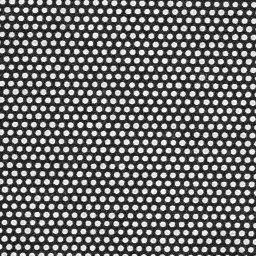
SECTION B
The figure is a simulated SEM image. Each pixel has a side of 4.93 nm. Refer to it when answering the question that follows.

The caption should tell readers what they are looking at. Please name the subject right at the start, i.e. a regular array of raised bodies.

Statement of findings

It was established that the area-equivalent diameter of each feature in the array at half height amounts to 25.5 nanometres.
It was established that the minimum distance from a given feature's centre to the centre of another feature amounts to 0.0444 µm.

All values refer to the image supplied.